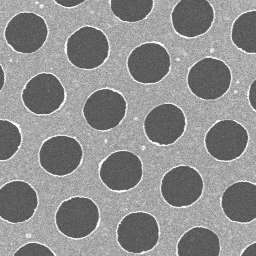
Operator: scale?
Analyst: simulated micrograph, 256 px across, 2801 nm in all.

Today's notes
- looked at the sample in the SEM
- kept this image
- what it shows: a regular array of holes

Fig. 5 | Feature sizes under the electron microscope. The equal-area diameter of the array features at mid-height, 454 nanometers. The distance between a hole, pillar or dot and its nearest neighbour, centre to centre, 685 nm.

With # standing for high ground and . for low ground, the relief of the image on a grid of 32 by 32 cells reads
#######...####.....###....######
##############.....###.....####.
#....##########...####.....###..
#.....####..##########....###...
#.....###....##########..####...
#....###......####..#########...
##..####......###....##########.
#########....###.....####..#####
##########..####.....###.....###
.###...##########....##......###
###.....################.....##.
###.....####...#########....###.
###.....###.....###############.
###....###......###...##########
###########....###.....#########
..#########....###.....####...##
..################.....###.....#
...###...##########...####.....#
..###.....################.....#
..###.....####...##########...##
#####.....###.....##############
######...###......###....#######
#############.....##.....#######
....##########..####.....####...
.....###############.....###....
.....###....#########...####....
....###.....################....
#..####.....###....##########...
#######.....###.....####..######
########...####.....###....#####
###..##########....###.....#####
##....##########..####.....###..